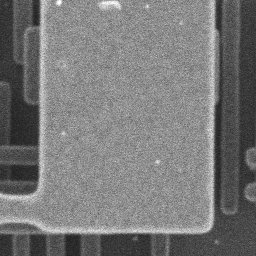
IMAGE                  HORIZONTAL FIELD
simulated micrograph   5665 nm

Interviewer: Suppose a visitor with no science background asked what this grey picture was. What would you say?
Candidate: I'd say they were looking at wiring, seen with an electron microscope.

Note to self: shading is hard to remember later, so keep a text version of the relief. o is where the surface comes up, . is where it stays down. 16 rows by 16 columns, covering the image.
...oooooooooo...
..ooooooooooo...
..oooooooooooo..
..oooooooooooo..
..oooooooooooo..
..oooooooooooo..
..oooooooooooo..
...oooooooooo...
...oooooooooo...
ooooooooooooo...
..ooooooooooo...
ooooooooooooo...
ooooooooooooo...
ooooooooooooo...
ooooooooooooo...
................